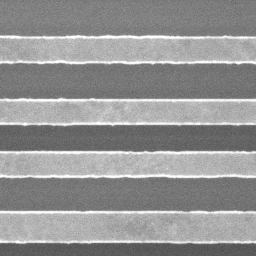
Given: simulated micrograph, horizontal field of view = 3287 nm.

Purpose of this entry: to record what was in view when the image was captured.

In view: lines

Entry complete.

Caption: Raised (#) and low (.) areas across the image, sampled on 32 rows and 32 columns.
................................
................................
................................
................................
................................
################################
################################
################################
................................
................................
................................
................................
################################
################################
################################
################################
................................
................................
................................
################################
################################
################################
................................
................................
................................
................................
################################
################################
################################
################################
................................
................................